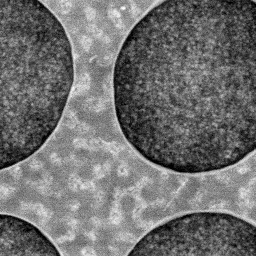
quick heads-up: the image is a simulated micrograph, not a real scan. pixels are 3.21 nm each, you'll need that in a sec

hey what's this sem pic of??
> holes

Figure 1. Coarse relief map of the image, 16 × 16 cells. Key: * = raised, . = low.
...*******......
....*****.......
....****........
....***.........
.....**.........
....***.........
....***.........
....***.........
...*****........
..*******.......
**********....**
****************
****************
.**********....*
...******.......
....****........